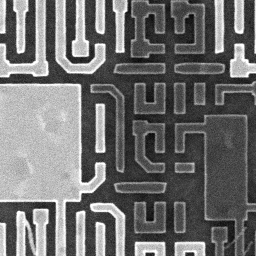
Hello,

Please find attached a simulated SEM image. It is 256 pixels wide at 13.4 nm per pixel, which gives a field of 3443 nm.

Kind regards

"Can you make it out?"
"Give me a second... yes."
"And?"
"wiring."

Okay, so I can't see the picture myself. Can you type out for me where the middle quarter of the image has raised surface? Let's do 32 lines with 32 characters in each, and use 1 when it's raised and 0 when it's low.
11111111100001111111111110001111
11111111000001111111111110001111
00000000000000000000000000000000
00000000000000000000000000000000
00000000000000000000000000000000
11110001111100000011000110001100
11110001111111000011000110001100
11110000000011100011000110001100
11110000000001100011000110001100
11110000000001100011100110001100
11110000110001100011111110001100
11110000110001100011111110001100
11110000110001100000000000000000
11110000110001100000000000000000
11110000110001100111100000000000
11110000110001100111111110001111
11110000110001100111111110001111
11110000110001100111100110001100
11110000110001100011000110001100
11110000110001100011000110001100
11110000110001100011000110001100
11110000110001100011000110001100
11110000000001100011000000000000
11110000000001100011100000000000
11110000000001100011110000000000
11110000110001100001111110001111
11110000110001100000111110001111
11110000110000000000000000000000
11110001110000000000000000000000
11110011110000000000000000000000
11111111100001111111111110000000
11111111000001111111111110000000